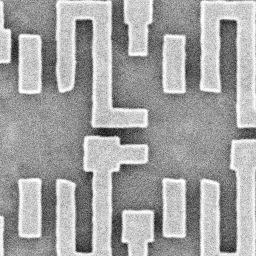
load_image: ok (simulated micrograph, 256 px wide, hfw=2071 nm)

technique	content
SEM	wiring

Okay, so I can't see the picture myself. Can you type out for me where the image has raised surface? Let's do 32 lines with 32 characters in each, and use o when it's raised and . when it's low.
.......ooooooo..ooo......ooooooo
.......ooooooo..ooo......ooooooo
.......ooo.ooo..ooo......ooo.ooo
o......oo...oo..oo.......oo...oo
o..o...oo...oo..oo...o...oo...oo
o..oo..oo...oo..oo..ooo..oo...oo
o..oo..oo...oo..oo..ooo..oo...oo
o..oo..oo...oo......ooo..oo...oo
...oo..oo...oo......ooo..oo...oo
...oo..oo...oo......ooo..oo...oo
...oo..oo...oo......ooo..oo...oo
...oo.......oo.......oo.......oo
............oo................oo
............oo................oo
............oooooo............oo
............oooooo............oo
................................
...........oooo.................
...........ooooooo...........ooo
...........ooooooo...........ooo
...........oooo..............ooo
...........ooo...............ooo
....o.......oo.......o........oo
...oo..oo...oo......ooo..oo...oo
...oo..oo...oo......ooo..oo...oo
...oo..oo...oo......ooo..oo...oo
...oo..oo...oo..ooo.ooo..oo...oo
...oo..oo...oo.oooo.ooo..oo...oo
..ooo..oo...oo.oooo.ooo..oo...oo
...o...oo...oo.oooo...o..oo...oo
.......oo...oo..ooo......oo...oo
.......ooo.ooo..oo.......ooo.ooo